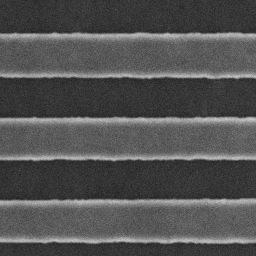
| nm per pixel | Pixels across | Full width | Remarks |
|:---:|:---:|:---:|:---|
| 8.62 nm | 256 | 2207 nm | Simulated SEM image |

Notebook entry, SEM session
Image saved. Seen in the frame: lines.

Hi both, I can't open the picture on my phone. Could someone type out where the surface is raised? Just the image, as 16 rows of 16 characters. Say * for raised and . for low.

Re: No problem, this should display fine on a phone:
................
................
****************
****************
****************
................
................
****************
****************
****************
................
................
...*************
****************
****************
................